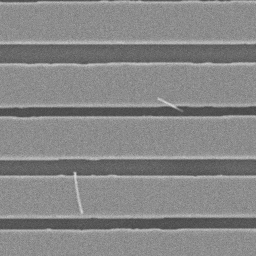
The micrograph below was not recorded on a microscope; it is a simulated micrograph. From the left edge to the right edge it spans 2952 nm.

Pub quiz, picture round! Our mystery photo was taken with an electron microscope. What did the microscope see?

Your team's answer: lines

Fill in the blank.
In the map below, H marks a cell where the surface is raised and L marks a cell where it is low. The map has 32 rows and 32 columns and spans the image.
HHHHHHHHHHHHHHHHHHHHHHHHHHHHHHHH
HHHHHHHHHHHHHHHHHHHHHHHHHHHHHHHH
HHHHHHHHHHHHHHHHHHHHHHHHHHHHHHHH
HHHHHHHHHHHHHHHHHHHHHHHHHHHHHHHH
HHHHHHHHHHHHHHHHHHHHHHHHHHHHHHHH
LLLLLLLLLLLLLLLLLLLLLLLLLLLLLLLL
LLLLLLLLLLLLLLLLLLLLLLLLLLLLLLLL
LLLLLLLLLLLLLLLLLLLLLLLLLLLLLLLL
HHHHHHHHHHHHHHHHHHHHHHHHHHHHHHHH
HHHHHHHHHHHHHHHHHHHHHHHHHHHHHHHH
HHHHHHHHHHHHHHHHHHHHHHHHHHHHHHHH
HHHHHHHHHHHHHHHHHHHHHHHHHHHHHHHH
HHHHHHHHHHHHHHHHHHHHHHHHHHHHHHHH
LLLLLLLLLLLLLLLLLLLLLLLLLLLLLLLL
LLLLLLLLLLLLLLLLLLLLLLLLLLLLLLLL
HHHHHHHHHHHHHHHHHHHHHHHHHHHHHHHH
HHHHHHHHHHHHHHHHHHHHHHHHHHHHHHHH
HHHHHHHHHHHHHHHHHHHHHHHHHHHHHHHH
HHHHHHHHHHHHHHHHHHHHHHHHHHHHHHHH
HHHHHHHHHHHHHHHHHHHHHHHHHHHHHHHH
LLLLLLLLLLLLLLLLLLLLLLLLLLLLLLLL
LLLLLLLLLLLLLLLLLLLLLLLLLLLLLLLL
HHHHHHHHHHHHHHHHHHHHHHHHHHHHHHHH
HHHHHHHHHHHHHHHHHHHHHHHHHHHHHHHH
HHHHHHHHHHHHHHHHHHHHHHHHHHHHHHHH
HHHHHHHHHHHHHHHHHHHHHHHHHHHHHHHH
HHHHHHHHHHHHHHHHHHHHHHHHHHHHHHHH
LLLLLLLLLLLLLLLLLLLLLLLLLLLLLLLL
LLLLLLLLLLLLLLLLLLLLLLLLLLLLLLLL
HHHHHHHHHHHHHHHHHHHHHHHHHHHHHHHH
HHHHHHHHHHHHHHHHHHHHHHHHHHHHHHHH
HHHHHHHHHHHHHHHHHHHHHHHHHHHHHHHH